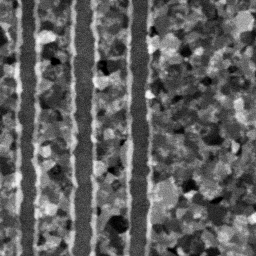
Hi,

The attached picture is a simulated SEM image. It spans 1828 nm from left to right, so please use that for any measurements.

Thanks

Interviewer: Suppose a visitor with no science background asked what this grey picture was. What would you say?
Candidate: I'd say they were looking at parallel lines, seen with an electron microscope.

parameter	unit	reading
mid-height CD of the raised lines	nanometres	253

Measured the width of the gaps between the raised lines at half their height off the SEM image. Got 144 nm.